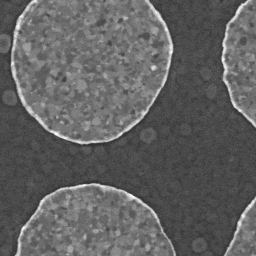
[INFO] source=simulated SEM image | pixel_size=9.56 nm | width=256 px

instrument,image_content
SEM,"raised bodies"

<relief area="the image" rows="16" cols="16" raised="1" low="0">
0011111111000001
0111111111000011
0111111111100011
0111111111100011
0111111111000011
0111111111000011
0011111110000001
0011111110000000
0000111000000000
0000000000000000
0000000000000000
0000000000000000
0001111110000000
0011111111000001
0111111111000001
0111111111100011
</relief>